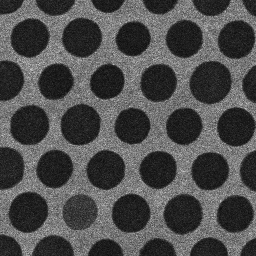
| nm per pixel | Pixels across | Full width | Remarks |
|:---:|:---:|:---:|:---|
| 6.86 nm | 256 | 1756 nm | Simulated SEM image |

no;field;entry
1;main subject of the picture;a regular array of holes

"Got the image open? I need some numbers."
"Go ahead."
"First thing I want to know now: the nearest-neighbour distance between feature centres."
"345 nanometers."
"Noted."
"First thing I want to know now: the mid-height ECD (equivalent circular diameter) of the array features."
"253 nm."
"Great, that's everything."